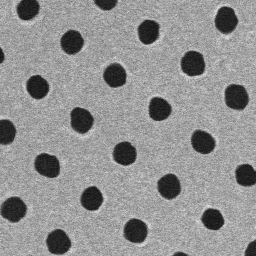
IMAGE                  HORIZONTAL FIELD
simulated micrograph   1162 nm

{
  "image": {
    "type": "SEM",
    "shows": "a regular array of holes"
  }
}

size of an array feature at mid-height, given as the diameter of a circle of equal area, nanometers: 107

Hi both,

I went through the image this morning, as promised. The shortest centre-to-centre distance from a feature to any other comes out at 248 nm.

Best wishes